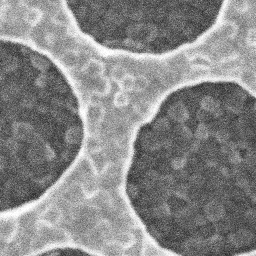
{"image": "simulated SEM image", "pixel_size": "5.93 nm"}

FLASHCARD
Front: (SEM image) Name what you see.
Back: holes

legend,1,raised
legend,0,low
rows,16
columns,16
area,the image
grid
1111000000000011
1111100000000111
1111110000001111
0001111111111111
0000111111111111
0000111111100001
0000011111000000
0000011110000000
0000011100000000
0000011100000000
0000111100000000
0001111100000000
0011111100000000
1111111110000000
1111111110000000
1111011111000000